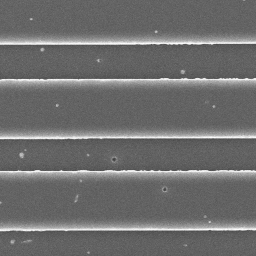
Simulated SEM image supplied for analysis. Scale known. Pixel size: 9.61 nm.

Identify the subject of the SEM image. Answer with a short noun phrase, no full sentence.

lines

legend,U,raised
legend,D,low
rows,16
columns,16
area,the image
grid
UUUUUUUUUUUUUUUU
UUUUUUUUUUUUUUUU
UUUUUUUUUUUUUUUU
DDDDDDDDDDDDDDDD
DDDDDDDDDDDDDDDD
UUUUUUUUUUUUUUUU
UUUUUUUUUUUUUUUU
UUUUUUUUUUUUUUUU
UUUUUUUUUUUUUUUU
DDDDDDDDDDDDDDDD
DDDDDDDDDDDDDDDD
UUUUUUUUUUUUUUUU
UUUUUUUUUUUUUUUU
UUUUUUUUUUUUUUUU
DDDDDDDDDDDDDDDD
DDDDDDDDDDDDDDDD